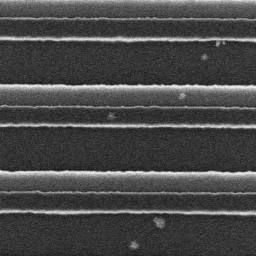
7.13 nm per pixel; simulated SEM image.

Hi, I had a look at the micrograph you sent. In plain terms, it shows lines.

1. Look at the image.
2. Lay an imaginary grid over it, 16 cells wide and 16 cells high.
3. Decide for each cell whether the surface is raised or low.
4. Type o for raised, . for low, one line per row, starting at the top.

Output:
oooooooooooooooo
oooooooooooooooo
................
................
................
oooooooooooooooo
oooooooooooooooo
oooooooooooooooo
................
................
................
oooooooooooooooo
oooooooooooooooo
................
................
................